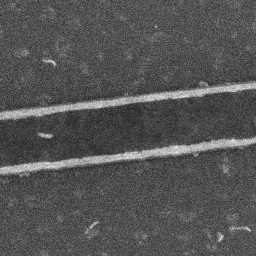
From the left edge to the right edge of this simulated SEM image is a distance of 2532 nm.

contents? one or a few lines or trenches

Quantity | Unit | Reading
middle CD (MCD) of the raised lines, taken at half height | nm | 551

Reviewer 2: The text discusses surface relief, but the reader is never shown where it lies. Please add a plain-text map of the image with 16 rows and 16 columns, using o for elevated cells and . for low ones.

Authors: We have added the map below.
................
................
................
................
................
..............oo
......oooooooooo
oooooooooooooooo
oooooooooooooooo
oooooooooo......
oo..............
................
................
................
................
................